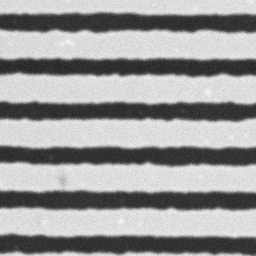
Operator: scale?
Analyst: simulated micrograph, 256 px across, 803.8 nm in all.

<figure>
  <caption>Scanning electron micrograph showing lines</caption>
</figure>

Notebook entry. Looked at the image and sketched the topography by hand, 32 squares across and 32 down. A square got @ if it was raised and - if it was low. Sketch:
@@@@@@@@@@@@@@@@@@@@@@@@@@@@@@@@
@@@@@@@@@@@@--@@@@@@@@@@@@@@@@@@
--------------------------------
--------------------------------
@@@@@@@@@@@@@@@@@@@@@@@@@@@@@@@@
@@@@@@@@@@@@@@@@@@@@@@@@@@@@@@@@
@@@@@@@@@@@@@@@@@@@@@@@@@@@@@@@@
--------------------------------
--------------------------------
@@@@@@@-@@@@-@@-@@@@@@@----@@--@
@@@@@@@@@@@@@@@@@@@@@@@@@@@@@@@@
@@@@@@@@@@@@@@@@@@@@@@@@@@@@@@@@
@@@@@@@@@@@@@@@@@@@@@@@@@@@@@@@@
--------------------------------
--------------------------------
@@@@@@@@@@@@@@@@@@@@@@@@@@@@@@@@
@@@@@@@@@@@@@@@@@@@@@@@@@@@@@@@@
@@@@@@@@@@@@@@@@@@@@@@@@@@@@@@@@
--------------------------------
--------------------------------
@@@@------@--@----@-------------
@@@@@@@@@@@@@@@@@@@@@@@@@@@@@@@@
@@@@@@@@@@@@@@@@@@@@@@@@@@@@@@@@
@@@@@@@@@@@@@@@@@@@@@@@@@@@@@@@@
--------------------------------
--------------------------------
@@@@@@@@@@@@@@@@@@@@@@@@@@@@@@@@
@@@@@@@@@@@@@@@@@@@@@@@@@@@@@@@@
@@@@@@@@@@@@@@@@@@@@@@@@@@@@@@@@
------@@@@---------@@@@@@@-@@@@@
--------------------------------
--------------------------------